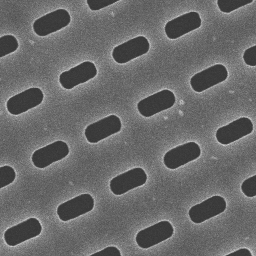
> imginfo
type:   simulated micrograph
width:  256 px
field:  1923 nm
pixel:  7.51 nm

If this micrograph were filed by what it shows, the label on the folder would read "a regular array of holes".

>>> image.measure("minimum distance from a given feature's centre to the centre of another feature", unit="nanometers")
438